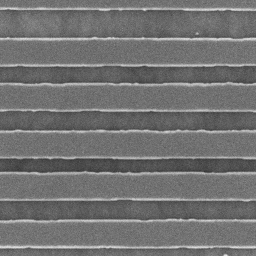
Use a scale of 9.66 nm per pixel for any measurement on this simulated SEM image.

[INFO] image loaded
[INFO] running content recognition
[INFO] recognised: lines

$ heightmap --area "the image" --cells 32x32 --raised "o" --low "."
oooooooooooooooooooooooooooooooo
................................
................................
................................
................................
oooooooooooooooooooooooooooooooo
oooooooooooooooooooooooooooooooo
oooooooooooooooooooooooooooooooo
................................
................................
ooo..o..oooooo.ooo..ooooo.oooo.o
oooooooooooooooooooooooooooooooo
oooooooooooooooooooooooooooooooo
oooooooooooooooooooooooooooooooo
................................
................................
oooooooooooooooooooooooooooooooo
oooooooooooooooooooooooooooooooo
oooooooooooooooooooooooooooooooo
oooooooooooooooooooooooooooooooo
................................
................................
oooooooooooooooooooooooooooooooo
oooooooooooooooooooooooooooooooo
oooooooooooooooooooooooooooooooo
................................
................................
.....................oooo.......
oooooooooooooooooooooooooooooooo
oooooooooooooooooooooooooooooooo
oooooooooooooooooooooooooooooooo
................................